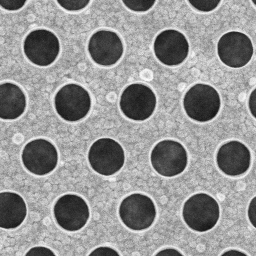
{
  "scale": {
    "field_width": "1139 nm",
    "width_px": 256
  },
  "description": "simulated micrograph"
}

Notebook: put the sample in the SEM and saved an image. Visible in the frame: a regular array of holes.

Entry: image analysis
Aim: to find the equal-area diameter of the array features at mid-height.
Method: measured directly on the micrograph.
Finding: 167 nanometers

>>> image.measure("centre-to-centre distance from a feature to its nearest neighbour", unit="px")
62.9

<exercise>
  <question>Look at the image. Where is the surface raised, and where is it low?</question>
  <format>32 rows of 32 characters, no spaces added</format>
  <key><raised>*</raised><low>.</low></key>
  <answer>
...****....****....*****...*****
*****************.*******.******
********************************
********************************
***....****....*****...*****...*
***....****....****.....***.....
***....****....****.....***.....
****...*****...*****...*****...*
********************************
********************************
..*******.******..******..******
...****....****....****....****.
...****....****.....***.....***.
...****....****....****....****.
...****....*****...****....*****
********************************
********************************
****..******..*******.**********
***....****....****....****....*
***....****.....***....****....*
***....****....****....****....*
****..******...*****...*****...*
********************************
********************************
...*****..******..******..******
...****....****....****....****.
...****....****.....***.....***.
...****....****....****....****.
..******..******...*****..******
********************************
********************************
***....****....*****...*****..**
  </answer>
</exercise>